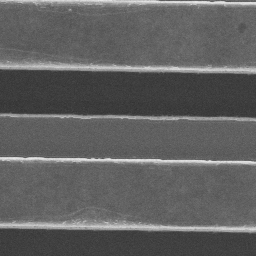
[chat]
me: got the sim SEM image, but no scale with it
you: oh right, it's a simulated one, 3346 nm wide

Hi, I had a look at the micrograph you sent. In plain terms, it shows lines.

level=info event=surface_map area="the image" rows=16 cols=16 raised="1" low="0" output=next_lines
1111111111111111
1111111111111111
1111111111111111
1111111111111111
0000000000000000
0000000000000000
0000000000000000
1111111111111110
1111111111111111
1111111111111111
1111111111111111
1111111111111111
1111111111111111
1111111111111111
0000000000000000
0000000000000000